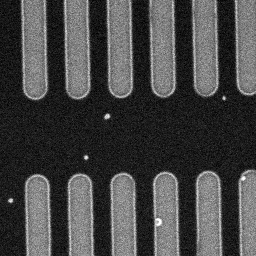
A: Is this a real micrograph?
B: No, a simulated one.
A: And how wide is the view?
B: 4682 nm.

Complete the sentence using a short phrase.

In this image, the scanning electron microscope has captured groups of lines, slits or small figures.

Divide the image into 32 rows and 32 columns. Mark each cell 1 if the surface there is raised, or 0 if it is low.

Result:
11100011000110001110001100011100
11100011000111001110001100011100
11100011000111001110001100011100
11100011000111001110001100011100
11100011000111001110001100011100
11100011000111001110001100011100
11100011000111001110001100011100
11100011000111001110001100011100
11100011000111001110001100011100
11100011000111001110001100011100
11100011000111001110001100011100
11100011100111001110011110011100
11111111111111111111111111111111
11111111111111111111111111111111
11111111111111111111111111111111
11111111111111111111111111111111
11111111111111111111111111111111
11111111111111111111111111111111
11111111111111111111111111111111
11111111111111111111111111111111
11111111111111111111111111111111
11111111111111111111111111111110
11110011100111000111001110011100
11100011100111000110001110011100
11100011100111000110001110011100
11100011100111000110001110011100
11100011100111000110001110011100
11100011100111000111001110011100
11100011100011000111001110001100
11100011100111000110001110001100
11100011100011000110001110001100
11100011100011000110001110001100